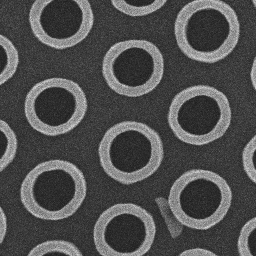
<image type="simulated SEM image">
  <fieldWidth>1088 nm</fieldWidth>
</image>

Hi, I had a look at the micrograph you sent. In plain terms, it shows ring-shaped raised bodies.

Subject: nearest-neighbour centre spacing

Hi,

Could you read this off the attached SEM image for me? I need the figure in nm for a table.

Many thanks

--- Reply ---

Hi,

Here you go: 351